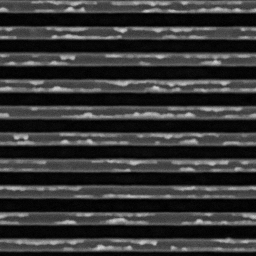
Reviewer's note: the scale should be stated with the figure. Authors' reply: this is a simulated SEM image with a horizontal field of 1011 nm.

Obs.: parallel lines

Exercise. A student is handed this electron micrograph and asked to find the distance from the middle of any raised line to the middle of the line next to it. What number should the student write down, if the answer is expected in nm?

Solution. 105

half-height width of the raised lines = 0.0469 um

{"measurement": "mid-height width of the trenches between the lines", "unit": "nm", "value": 57.8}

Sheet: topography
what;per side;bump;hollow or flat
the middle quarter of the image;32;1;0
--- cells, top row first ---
00000000000000000000000000000000
00000000000000000000000000000000
00000000000000000000000000000000
00000000000000000000000000000000
11111111111111111111111111111111
11111111111111111111111111111111
11111111111111111111111111111111
00000000000000000000000000000000
00000000000000000000000000000000
00000000000000000000000000000000
00000000000000000000000000000000
11111111111111111111111111111111
11111111111111111111111111111111
11111111111111111111111111111111
00000000000000000000000000000000
00000000000000000000000000000000
00000000000000000000000000000000
11111111111111111111111111111111
11111111111111111111111111111111
11111111111111111111111111111111
00000000000000000000000000000000
00000000000000000000000000000000
00000000000000000000000000000000
00000000000000000000000000000000
11111111111111111111111111111111
11111111111111111111111111111111
11111111111111111111111111111111
00000000000000000000000000000000
00000000000000000000000000000000
00000000000000000000000000000000
00000001000110000000000000000000
11111111111111111111111111111111